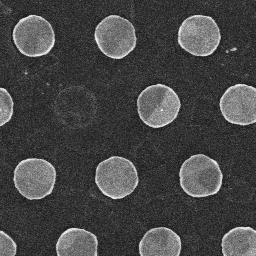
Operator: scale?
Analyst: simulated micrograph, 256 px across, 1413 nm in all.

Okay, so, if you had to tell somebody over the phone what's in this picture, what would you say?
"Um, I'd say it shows raised bodies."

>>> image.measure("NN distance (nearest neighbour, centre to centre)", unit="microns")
0.451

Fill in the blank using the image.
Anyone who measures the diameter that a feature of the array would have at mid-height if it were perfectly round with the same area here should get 230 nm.